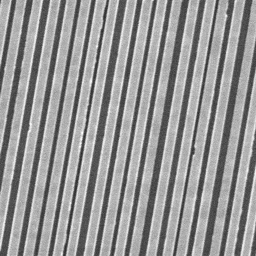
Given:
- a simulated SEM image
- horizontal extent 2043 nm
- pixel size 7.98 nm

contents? parallel lines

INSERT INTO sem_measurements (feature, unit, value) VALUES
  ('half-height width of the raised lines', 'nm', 67.8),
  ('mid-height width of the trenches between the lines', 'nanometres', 53.1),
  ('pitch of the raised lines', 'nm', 123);